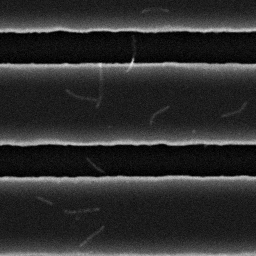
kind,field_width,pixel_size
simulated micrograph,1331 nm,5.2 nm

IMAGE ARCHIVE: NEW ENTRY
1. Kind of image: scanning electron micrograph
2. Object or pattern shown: lines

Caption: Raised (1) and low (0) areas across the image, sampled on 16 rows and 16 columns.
1111111111111111
1111111111111111
0000000000000000
0000000000000000
1111111111111111
1111111111111111
1111111111111111
1111111111111111
1111111111111111
0000000000000000
0000000000000000
1111111111111111
1111111111111111
1111111111111111
1111111111111111
1111111111111111